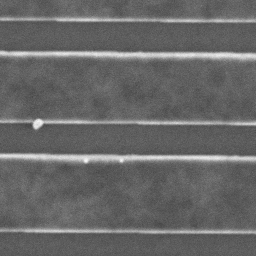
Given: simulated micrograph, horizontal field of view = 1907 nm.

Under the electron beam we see lines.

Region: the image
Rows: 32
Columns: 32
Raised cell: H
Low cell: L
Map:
HHHHHHHHHHHHHHHHHHHHHHHHHHHHHHHH
HHHHHHHHHHHHHHHHHHHHHHHHHHHHHHHH
LLLLLLLHHHHHHHHHHHHHHHHHHHHHHHHH
LLLLLLLLLLLLLLLLLLLLLLLLLLLLLLLL
LLLLLLLLLLLLLLLLLLLLLLLLLLLLLLLL
LLLLLLLLLLLLLLLLLLLLLLLLLLLLLLLL
HHHHHLLHLHHLLLLLLLLLLLLLLLLLLLLL
HHHHHHHHHHHHHHHHHHHHHHHHHHHHHHHH
HHHHHHHHHHHHHHHHHHHHHHHHHHHHHHHH
HHHHHHHHHHHHHHHHHHHHHHHHHHHHHHHH
HHHHHHHHHHHHHHHHHHHHHHHHHHHHHHHH
HHHHHHHHHHHHHHHHHHHHHHHHHHHHHHHH
HHHHHHHHHHHHHHHHHHHHHHHHHHHHHHHH
HHHHHHHHHHHHHHHHHHHHHHHHHHHHHHHH
HHHHHHHHHHHHHHHHHHHHHHHHHHHHHHHH
LLLLHLLLLLLLLLLLLLLLLLLLLLLLLHHH
LLLLLLLLLLLLLLLLLLLLLLLLLLLLLLLL
LLLLLLLLLLLLLLLLLLLLLLLLLLLLLLLL
LLLLLLLLLLLLLLLLLLLLLLLLLLLLLLLL
HHHHHHHHHHHHHHHHHHHHHHLHHLLLLLLL
HHHHHHHHHHHHHHHHHHHHHHHHHHHHHHHH
HHHHHHHHHHHHHHHHHHHHHHHHHHHHHHHH
HHHHHHHHHHHHHHHHHHHHHHHHHHHHHHHH
HHHHHHHHHHHHHHHHHHHHHHHHHHHHHHHH
HHHHHHHHHHHHHHHHHHHHHHHHHHHHHHHH
HHHHHHHHHHHHHHHHHHHHHHHHHHHHHHHH
HHHHHHHHHHHHHHHHHHHHHHHHHHHHHHHH
HHHHHHHHHHHHHHHHHHHHHHHHHHHHHHHH
HHHHHHHHHHHHHHHHHHHHHHHHHHHHHHHH
LLLLLLLLLLLLLLLLLLLLLLLLLLLLLLLL
LLLLLLLLLLLLLLLLLLLLLLLLLLLLLLLL
LLLLLLLLLLLLLLLLLLLLLLLLLLLLLLLL